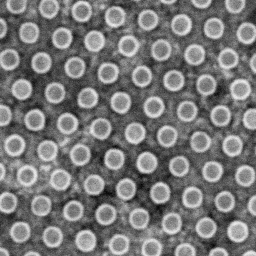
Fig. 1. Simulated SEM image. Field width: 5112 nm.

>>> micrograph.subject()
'a regular array of raised bodies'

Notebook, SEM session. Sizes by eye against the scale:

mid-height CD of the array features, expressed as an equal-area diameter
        370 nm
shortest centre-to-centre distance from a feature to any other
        643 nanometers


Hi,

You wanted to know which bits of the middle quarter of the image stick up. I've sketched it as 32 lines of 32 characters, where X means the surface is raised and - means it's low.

XXXXX-----XX--------------------
-XXXX----XXXX-----XXX-----------
-XXX-----XXXX----XXXXX----XXX---
---------XXXX----XXXX----XXXXX--
----------XX------XXX----XXXXX--
-------------------------XXXX---
-----XX-------------------------
----XXXX-----XX-----------------
----XXXX----XXXX----------------
----XXXX----XXXX-----XXX--------
-----XX-----XXXX----XXXXX----XXX
-------------XXX----XXXXX----XXX
---------------------XXX-----XXX
XXX--------------------------XXX
XXX----XXXX---------------------
XXX----XXXX-----XXX-------------
XX-----XXXX-----XXXX----XXXX----
-------XXXX-----XXXX----XXXX----
---------X------XXXX----XXXX----
-----------------X------XXX-----
---XX---------------------------
--XXXX------X-------------------
--XXXX-----XXX------X-----------
--XXXX----XXXXX----XXXX-----XX--
---XX------XXXX---XXXXX----XXXX-
-----------XXX-----XXXX----XXXX-
-------------------XXX-----XXXX-
X---------------------------XX--
X-----XXX-----------------------
X----XXXXX----XXX---------------
X----XXXXX----XXX------XX-------
------XXX----XXXXX----XXXX-----X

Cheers